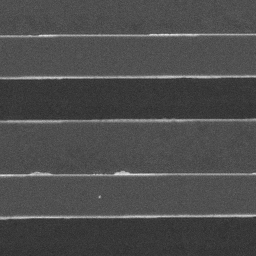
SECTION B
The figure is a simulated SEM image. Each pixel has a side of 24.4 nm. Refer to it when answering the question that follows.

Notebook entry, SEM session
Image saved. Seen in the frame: lines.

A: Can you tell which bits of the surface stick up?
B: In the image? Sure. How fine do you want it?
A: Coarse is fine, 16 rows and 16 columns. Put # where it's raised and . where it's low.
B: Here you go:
################
################
################
################
################
................
................
................
################
################
################
################
################
############....
................
................